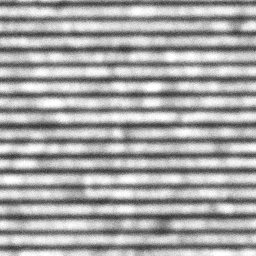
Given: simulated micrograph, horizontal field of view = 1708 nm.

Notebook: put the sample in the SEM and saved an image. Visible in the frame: parallel lines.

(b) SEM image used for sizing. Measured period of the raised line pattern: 102 nanometres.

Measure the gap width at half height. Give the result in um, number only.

0.0467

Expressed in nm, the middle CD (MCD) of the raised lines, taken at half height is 53.4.